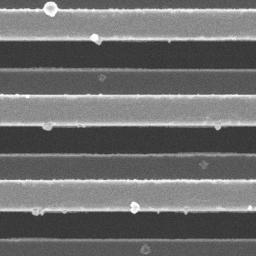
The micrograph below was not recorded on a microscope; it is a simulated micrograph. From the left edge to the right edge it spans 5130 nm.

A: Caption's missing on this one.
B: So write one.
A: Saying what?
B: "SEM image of lines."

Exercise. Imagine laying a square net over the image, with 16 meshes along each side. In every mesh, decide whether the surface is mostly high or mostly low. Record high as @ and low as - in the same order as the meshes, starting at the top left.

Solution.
@@@@@@@@@@@@@@@@
@@@@@@@@@@@@@@@@
-----@@---@-----
----------------
@@@@@@@@@@@@@@@@
@@@@@@@@@@@@@@@@
@@@@@@@@@@@@@@@@
@@@@@@@@@@@@@@@@
----------------
----------------
@@@@@@@@@@@@@@@@
@@@@@@@@@@@@@@@@
@@@@@@@@@@@@@@@@
----------------
----------------
@@@@@@@@@@@@@@@@